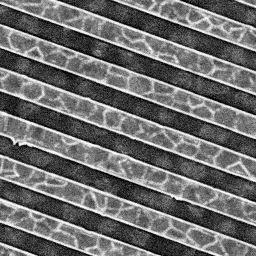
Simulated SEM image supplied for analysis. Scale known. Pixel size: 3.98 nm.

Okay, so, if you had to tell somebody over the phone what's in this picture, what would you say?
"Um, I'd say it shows parallel lines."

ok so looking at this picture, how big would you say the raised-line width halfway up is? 0.081 micrometres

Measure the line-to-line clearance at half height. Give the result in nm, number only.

81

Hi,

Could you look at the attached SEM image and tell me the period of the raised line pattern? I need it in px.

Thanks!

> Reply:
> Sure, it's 41.1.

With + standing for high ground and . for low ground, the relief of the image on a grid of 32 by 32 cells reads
++++++++........+++++++........+
...++++++++.......++++++++......
......++++++++.......++++++++...
+........++++++++.......++++++++
++++........+++++++........+++++
+++++++.......++++++++........++
..+++++++........++++++++.......
.....+++++++........++++++++....
........+++++++........+++++++..
+++.......++++++++.......+++++++
++++++.......++++++++.......++++
.+++++++........+++++++........+
....+++++++........+++++++......
......++++++++.......++++++++...
+........++++++++.......++++++++
++++........++++++++.......+++++
+++++++........+++++++........++
..++++++++.......++++++++.......
.....++++++++.......++++++++....
........++++++++.......++++++++.
+++........+++++++........++++++
++++++.......++++++++........+++
.++++++++.......++++++++........
....+++++++........+++++++......
......++++++++........+++++++...
++.......++++++++.......++++++++
++++........++++++++.......+++++
+++++++........++++++++.......++
..++++++++.......++++++++.......
.....++++++++.......++++++++....
........++++++++.......++++++++.
+++........++++++++.......++++++